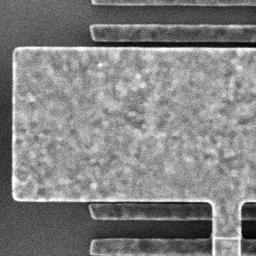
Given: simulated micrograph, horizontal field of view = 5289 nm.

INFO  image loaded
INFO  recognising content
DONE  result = wiring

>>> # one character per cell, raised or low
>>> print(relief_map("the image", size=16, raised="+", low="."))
................
................
................
.+++++++++++++++
.+++++++++++++++
.+++++++++++++++
.+++++++++++++++
.+++++++++++++++
.+++++++++++++++
.+++++++++++++++
.+++++++++++++++
.+++++++++++++++
.+++++++++++++++
.............++.
.............++.
.............++.